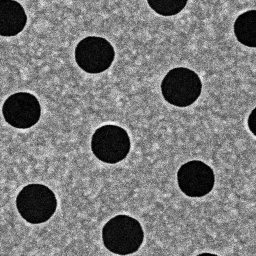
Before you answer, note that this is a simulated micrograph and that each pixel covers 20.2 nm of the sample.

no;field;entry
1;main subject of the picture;holes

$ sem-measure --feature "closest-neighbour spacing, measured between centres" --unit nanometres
1850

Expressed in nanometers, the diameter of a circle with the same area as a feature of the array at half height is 805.